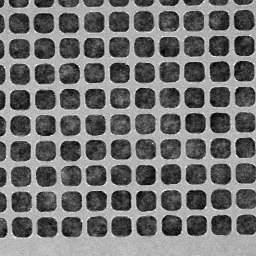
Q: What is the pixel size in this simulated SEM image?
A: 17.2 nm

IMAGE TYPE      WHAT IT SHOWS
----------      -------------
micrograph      a regular array of holes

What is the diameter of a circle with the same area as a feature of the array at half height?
0.385 micrometres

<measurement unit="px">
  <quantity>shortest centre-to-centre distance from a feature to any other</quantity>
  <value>24.8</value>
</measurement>